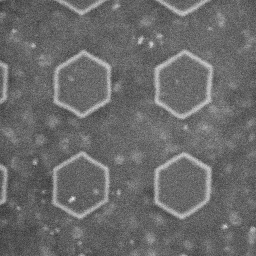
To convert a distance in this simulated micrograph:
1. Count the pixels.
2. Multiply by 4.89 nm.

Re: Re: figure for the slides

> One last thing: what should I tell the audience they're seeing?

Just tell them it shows raised bodies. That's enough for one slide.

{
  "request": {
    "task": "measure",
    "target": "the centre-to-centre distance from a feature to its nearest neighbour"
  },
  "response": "494 nanometers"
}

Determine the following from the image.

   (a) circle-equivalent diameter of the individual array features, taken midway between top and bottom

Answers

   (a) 57.8 pixels